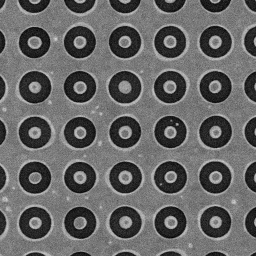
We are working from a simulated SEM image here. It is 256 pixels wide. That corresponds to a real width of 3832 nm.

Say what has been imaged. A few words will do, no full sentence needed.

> an array of small figures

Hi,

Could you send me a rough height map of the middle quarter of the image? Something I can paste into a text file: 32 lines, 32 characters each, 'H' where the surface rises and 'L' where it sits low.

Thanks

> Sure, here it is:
HHHHHHHHHHHHHHHHHHHHHHHHHHHHHHHH
HHHHHHHHHHHHHHHHHHHHHHHHHHLHHHHH
HLLLLLHHHHHHHLLLLLHHHHHHLLLLLHHH
HLLLLLLLHHHHLLLLLLLHHHHLLLLLLLHH
LLLLLLLLHHHLLLLLLLLHHHHLLLHLLLLH
LLLHHLLLHHHLLLHHLLLLHHLLLHHHLLLH
LLLHHLLLHHHLLLHHLLLHHHLLLHHHLLLH
LLLLLLLLHHHLLLLLLLLHHHHLLLLLLLHH
HLLLLLLHHHHHLLLLLLLHHHHLLLLLLLHH
HHHLLLHHHHHHHLLLLLHHHHHHLLLLHHHH
HHHHHHHHHHHHHHHHHHHHHHHHHHHHHHHH
HHHHHHHHHHHHHHHHHHHHHHHHHHHHHHHH
HHHHHHHHHHHHHHHHHHHHHHHHHHHHHHHH
HHLLLLHHHHHHHHLLLLHHHHHHLLLLLHHH
HLLLLLLHHHHHLLLLLLLHHHHLLLLLLLHH
LLLLLLLLHHHHLLLLLLLHHHHLLLLLLLLH
LLLHHLLLHHHLLLHHLLLHHHLLLLHHLLLH
LLLHHLLLHHHLLLHHLLLHHHLLLHHHLLLH
LLLLHLLLHHHHLLLLLLLHHHHLLLLLLLLH
LLLLLLLHHHHHLLLLLLLHHHHLLLLLLLHH
HLLLLLHHHHHHHLLLLLHHHHHHLLLLLHHH
HHHHHHHHHHHHHHHHHHHHHHHHHHHHHHHH
HHHHHHHHHHHHHHHHHHHHHHHHHHHHHHHH
HHHHHHHHHHHHHHHHHHHHHHHHHHHHHHHH
HHLLLHHHHHHHHHLLLHHHHHHHHLLLHHHH
HLLLLLLHHHHHLLLLLLHHHHHHLLLLLLHH
LLLLLLLLHHHHLLLLLLLHHHHLLLLLLLHH
LLLHHLLLHHHLLLHHLLLHHHLLLLHHLLLH
LLLHHLLLHHHLLLHHHLLLHHLLLHHHLLLH
LLLHHLLLHHHLLLLHLLLLHHLLLLHLLLLH
LLLLLLLHHHHHLLLLLLLHHHHLLLLLLLHH
HHLLLLHHHHHHHLLLLLHHHHHHLLLLLHHH